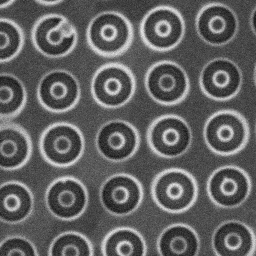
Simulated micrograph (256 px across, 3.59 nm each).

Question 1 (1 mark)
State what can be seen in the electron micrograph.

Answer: an array of small figures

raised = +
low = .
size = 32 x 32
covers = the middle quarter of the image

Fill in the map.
+++++++++++...+++++++++.....++++
+++++++++.......++++++.......+++
.+++++++.........++++.........++
..++++++.........++++...+++....+
...++++....++....++++...+++....+
...++++....+++...++++...++++...+
....+++....+++...++++....+.....+
....+++..........+++++........++
...+++++........+++++++......+++
...++++++......+++++++++....++++
..+++++++++..+++++++++++++++++++
++++++++++++++++++++++++++++++++
++++++++++++++++++++++++++++++++
+++++++++++++++++++++++++....+++
++++++++++++..+++++++++.......++
..++++++++.......+++++.........+
...++++++.........++++.........+
....+++++.........+++....+++...+
....++++...++++...+++....+++....
+....+++...++++...++++....++...+
+....++++...++....++++.........+
+...+++++.........+++++.......++
....++++++.......+++++++.....+++
...++++++++....+++++++++++++++++
..++++++++++++++++++++++++++++++
++++++++++++++++++++++++++++++++
++++++++++++++++++++++++++++++++
+++++++++++++++++++++++++......+
++++++++++++.....++++++.........
....+++++++.......+++++.........
.....+++++.........+++.....++...
.....+++++...++....+++....+++...